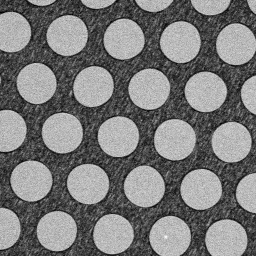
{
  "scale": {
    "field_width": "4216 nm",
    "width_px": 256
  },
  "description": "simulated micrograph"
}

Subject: an array of small figures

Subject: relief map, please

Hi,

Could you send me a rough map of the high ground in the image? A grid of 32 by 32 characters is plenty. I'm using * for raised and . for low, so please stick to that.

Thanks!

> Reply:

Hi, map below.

....**.....***...****...*****..*
.........................***....
***....***.....*................
****..*****..*****...***....***.
****..*****..*****..*****..*****
***...*****..*****..*****..*****
.......***...****...*****..*****
.....................***....***.
...***.....**...................
..*****...****...****...***.....
..*****..*****..*****..*****...*
..*****..*****..*****..*****..**
...***....***....****..*****..**
..................**....***....*
***...***.......................
***..*****...****...***.....**..
***..*****..*****..*****...****.
***..*****..*****..*****..*****.
**....***....****..*****...****.
..............**....***....****.
...**...........................
..****...****...****....**......
.*****..******..****...****...**
..****..******..*****..*****..**
..****...****...****...*****..**
.................**....****...**
**.....*.......................*
**...****...****....***.....*...
**...*****..*****..*****..****..
**...****...*****..*****..*****.
**...****...****...*****..*****.
.............**.....***...****..